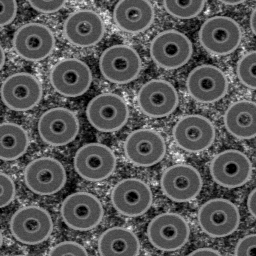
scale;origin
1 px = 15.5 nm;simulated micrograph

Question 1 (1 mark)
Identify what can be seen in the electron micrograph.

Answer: a regular array of ring-shaped raised bodies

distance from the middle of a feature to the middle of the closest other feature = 784 nm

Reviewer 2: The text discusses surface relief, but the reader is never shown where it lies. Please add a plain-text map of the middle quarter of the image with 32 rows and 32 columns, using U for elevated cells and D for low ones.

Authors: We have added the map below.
UUUUUUDDDUUUDDDDUUUDDDDDUUUUUDDD
UUUUUUDDDUUUUUDUUUUDDDDDDDDDDDDD
DDDUUUUDDDUUUUUUUUDDDDDDDDDDDDDD
DDDUUUUDDDDUUUUUUDDDDDDDDDDDDDDU
UDDUUUDDDDDDDUUDDDDDDUUUUDDDDDDU
UUUUUUDDDDDDDDDDDDDDUUUUUUUDDDDU
UUUUUDDDDDDDDDDDDDDUUUUUUUUDDDDU
UUUUDDDDDDDDDDDDDDDUUUDDUUUUDDDD
DDDDDDDDUUUUUUDDDDDUUUDDDUUUDDDD
DDDDDDDUUUUUUUUDDDDUUUDDDUUUDDDD
DDDDDDUUUUUUUUUUDDDUUUUUUUUUDDDD
UDDDDDUUUDDDDUUUDDDDUUUUUUUDDDDD
UUDDDDUUUDDDDUUUDDDDDUUUUUDDDDDD
UUUDDDUUUUDDUUUUDDDDDDDDDDDDDDUU
UUUDDDDUUUUUUUUDDDDDDDDDDDDDDUUU
UUUDDDDDUUUUUUDDDDDDDDDDDDDDUUUU
UUUDDDDDDUUUUDDDDDDDUDDDDDDDUUUD
UUUDDDDDDDDDDDDDDUUUUUUDDDDUUUUD
UUDDDDDDDDDDDDDDUUUUUUUUDDDDUUUD
UDDDDDDDDDDDDDDDUUUUUUUUUDDDUUUU
DDDDDUUUUUDDDDDUUUUDDDUUUDDDDUUU
DDDDUUUUUUUDDDDUUUUDDDUUUDDDDDDU
DDDUUUUUUUUUDDDDUUUUUUUUUDDDDDDD
DDDUUUDDDUUUUDDDUUUUUUUUDDDDDDDD
DDDUUUDDDUUUUDDDDUUUUUUDDDDDDDDD
DDDUUUDDDUUUUDDDDDDDDDDDDDDDUUDD
DDDUUUUUUUUUDDDDDDDDDDDDDDUUUUUU
DDDDUUUUUUUDDDDDDDDDDDDDDUUUUUUU
DDDDDDUUUUDDDDDDDDDDDDDDDUUUDDUU
DDDDDDDDDDDDDDUUUUUDDDDDUUUUDDDU
DDDDDDDDDDDDDUUUUUUUUDDDDUUUDDDU
DDDDDDDDDDDDDUUUUUUUUDDDDUUUUUUU